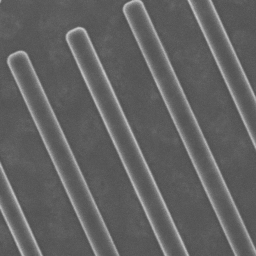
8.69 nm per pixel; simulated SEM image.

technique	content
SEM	one or a few lines or trenches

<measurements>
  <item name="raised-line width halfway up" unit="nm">174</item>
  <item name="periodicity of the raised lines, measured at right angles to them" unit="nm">552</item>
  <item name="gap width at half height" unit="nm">378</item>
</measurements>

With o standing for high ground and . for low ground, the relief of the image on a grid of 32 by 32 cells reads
................oo......ooo.....
................oo......ooo.....
................ooo......oo.....
................ooo......ooo....
........ooo......ooo......oo....
.........oo......ooo......ooo...
..o......ooo......ooo......oo...
.ooo......oo......ooo......ooo..
.ooo......ooo......oo......ooo..
..ooo.....ooo......ooo......ooo.
..ooo......ooo......oo......ooo.
...oo......ooo......ooo......ooo
...ooo......ooo......oo......ooo
....oo......ooo......ooo......oo
....ooo......oo......ooo......oo
....ooo......ooo......ooo......o
.....ooo......oo......ooo......o
.....ooo......ooo......ooo.....o
......ooo......oo......ooo......
......ooo......ooo......ooo.....
.......ooo......oo......ooo.....
.......ooo......ooo......oo.....
o.......ooo.....ooo......ooo....
o.......ooo......ooo......oo....
oo.......oo......ooo......ooo...
oo.......ooo......ooo......oo...
ooo.......oo......ooo......ooo..
.oo.......ooo......oo......ooo..
.ooo......ooo......ooo......ooo.
..oo.......ooo......oo......ooo.
..ooo......ooo......ooo......ooo
...oo.......ooo.....ooo......ooo